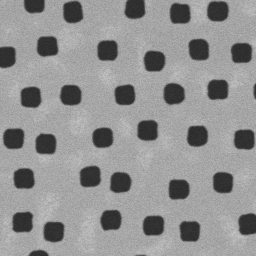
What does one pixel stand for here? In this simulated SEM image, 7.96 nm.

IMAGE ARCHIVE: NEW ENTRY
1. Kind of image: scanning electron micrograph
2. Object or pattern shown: a regular array of holes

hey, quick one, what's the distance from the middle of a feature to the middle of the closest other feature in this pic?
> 318 nm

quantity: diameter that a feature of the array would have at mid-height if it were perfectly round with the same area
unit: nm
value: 172